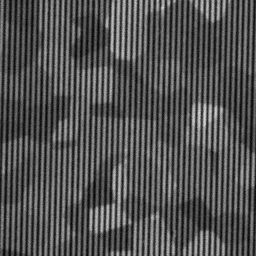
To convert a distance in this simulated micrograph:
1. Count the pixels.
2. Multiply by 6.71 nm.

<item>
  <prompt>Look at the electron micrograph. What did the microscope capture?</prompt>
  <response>parallel lines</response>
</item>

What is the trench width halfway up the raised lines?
21.8 nm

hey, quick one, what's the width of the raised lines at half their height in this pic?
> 2.62 pixels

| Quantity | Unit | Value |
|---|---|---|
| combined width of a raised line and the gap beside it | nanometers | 37.2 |